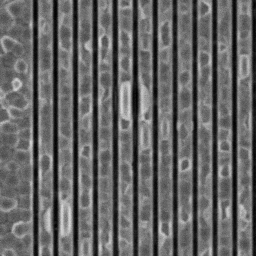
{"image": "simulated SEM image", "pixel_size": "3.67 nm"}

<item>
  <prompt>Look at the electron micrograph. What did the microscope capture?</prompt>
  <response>parallel lines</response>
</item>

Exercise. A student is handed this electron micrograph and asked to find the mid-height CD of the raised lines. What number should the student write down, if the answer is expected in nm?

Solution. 51.4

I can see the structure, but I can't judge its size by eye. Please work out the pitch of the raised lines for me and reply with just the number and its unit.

73.1 nanometers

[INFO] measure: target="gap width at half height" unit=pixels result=5.99